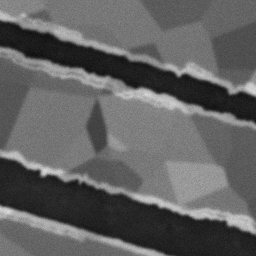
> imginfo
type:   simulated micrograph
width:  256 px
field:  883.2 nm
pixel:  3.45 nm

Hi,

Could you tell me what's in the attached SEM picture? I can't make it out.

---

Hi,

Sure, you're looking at one or a few lines or trenches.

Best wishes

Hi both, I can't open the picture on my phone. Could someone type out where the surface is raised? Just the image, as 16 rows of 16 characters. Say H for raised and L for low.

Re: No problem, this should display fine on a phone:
HHHHHHHHHHHHHHHH
LHHHHHHHHHHHHHHH
LLLLLHHHHHHHHHHH
HLLLLLLLHHHHHHHH
HHHHHLLLLLLHHHHH
HHHHHHHHLLLLLLHH
HHHHHHHHHHHLLLLL
HHHHHHHHHHHHHHHL
HHHHHHHHHHHHHHHH
HHHHHHHHHHHHHHHH
LLHHHHHHHHHHHHHH
LLLLLLHHHHHHHHHH
LLLLLLLLLHHHHHHH
HHLLLLLLLLLLHHHH
HHHHHLLLLLLLLLLL
HHHHHHHHLLLLLLLL